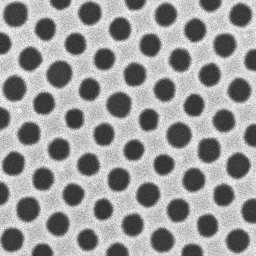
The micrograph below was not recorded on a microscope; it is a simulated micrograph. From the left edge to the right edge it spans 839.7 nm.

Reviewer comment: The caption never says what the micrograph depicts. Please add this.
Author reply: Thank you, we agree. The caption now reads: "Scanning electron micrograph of a regular array of holes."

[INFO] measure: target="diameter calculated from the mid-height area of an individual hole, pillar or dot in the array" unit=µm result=0.0699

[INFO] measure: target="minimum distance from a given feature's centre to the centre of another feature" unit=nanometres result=109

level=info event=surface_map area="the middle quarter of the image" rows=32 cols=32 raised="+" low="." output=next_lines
..++++++....++++...++++++++....+
..+++++++++++++.....++++++++..++
..+++++++++++++.....++++++++++++
..+++++++++++++.....++++++++++++
.++++...++++++++....++++...+++++
++++.....++++++++.+++++.....++++
++++.....+++++++++++++......++++
++++.....++++..++++++++....+++++
+++++...+++.....++++++++...++++.
+++++++++++......+++++++++++++..
+++++++++++......+++++++++++++..
++..+++++++......++++.++++++++..
+....+++++++....+++....++++++++.
.....++++++++++++++.....++++++++
+....++++++++++++++....+++++++++
+...+++++...+++++++....++++....+
++++++++....++++++++..++++.....+
+++++++.....++++++++++++++......
++++++++....++++++++++++++......
.+++++++....++++...+++++++.....+
.++++++++++++++.....+++++++...++
.++++++++++++++.....++++++++++++
.+++++.++++++++.....++++++++++++
++++....++++++++...++++....+++++
++++.....++++++++++++++....+++++
+++......+++++++++++++.....+++++
++++.....+++...++++++++....++++.
+++++..++++.....++++++++..++++..
+++++++++++.....++++++++++++++..
+++++++++++.....++++++++++++++..
+...+++++++.....+++....+++++++..
.....+++++++...+++......+++++++.